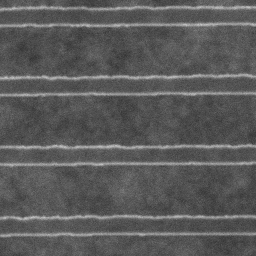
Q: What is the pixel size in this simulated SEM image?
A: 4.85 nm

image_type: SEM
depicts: lines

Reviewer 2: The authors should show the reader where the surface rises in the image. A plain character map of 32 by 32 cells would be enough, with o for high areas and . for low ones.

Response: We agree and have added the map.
................................
oooooooooooooooooooooooooooooooo
oooooooooooooooooooooooooooooooo
................................
................................
................................
................................
................................
................................
........................oooooooo
oooooooooooooooooooooooooooooooo
oooooooooooooooooooooooooooooooo
................................
................................
................................
................................
................................
................................
oooooooooooooooooooooooooooooooo
oooooooooooooooooooooooooooooooo
oooooooooo.oo...................
................................
................................
................................
................................
................................
................................
oooooooooooooooooooooooooooooooo
oooooooooooooooooooooooooooooooo
................................
................................
................................